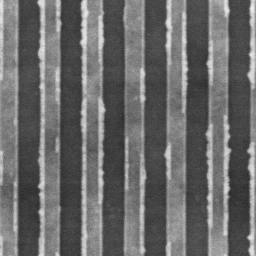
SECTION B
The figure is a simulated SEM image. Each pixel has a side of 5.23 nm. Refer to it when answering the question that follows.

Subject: parallel lines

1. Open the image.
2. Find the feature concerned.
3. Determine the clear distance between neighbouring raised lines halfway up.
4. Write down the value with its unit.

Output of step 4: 22.6 px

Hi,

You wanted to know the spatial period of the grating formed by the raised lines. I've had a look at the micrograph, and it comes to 220 nanometres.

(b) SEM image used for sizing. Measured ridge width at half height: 100 nanometers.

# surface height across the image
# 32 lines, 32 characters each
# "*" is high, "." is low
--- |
**...**...***...**...**...***..*
**...**...***...**...**...***..*
**...***..***...**...**...**...*
**...***..***...**...**...**...*
**...**...***...**...**...**...*
**...**...***...**...**...**...*
**...**...***...**...**...**...*
**...**...***...**...**...**...*
**...**...***...**...**...**...*
**...**...***...**...**...**...*
**...**...***...**...**...**...*
**...**...***...**...**...**...*
**...**...***...**...**...**...*
**...**...***...**...**...**...*
**...**...***...**...**...**...*
**...**...***...**...**...**...*
**...**...***...**...**...***..*
**...**...***...**...**...***..*
**...**...***...**...**...***..*
**...**...***...**...**...***..*
**...**...***...**...**...***..*
**...**...***...**...**...**...*
**...**...***...**...**...***..*
**...**...***...**...**...***..*
**...**...***...**...**...**...*
**...**...***...**...**...**...*
**...**...***...**...**...**...*
**...**...***...**...**...**...*
**...**...***...**...**...**...*
**...**...***...**...**...**...*
**...**...***...**...**...**...*
**...**...***...**...**...**...*